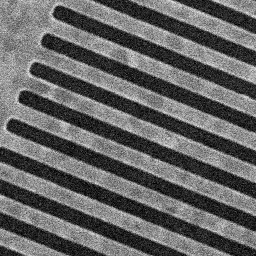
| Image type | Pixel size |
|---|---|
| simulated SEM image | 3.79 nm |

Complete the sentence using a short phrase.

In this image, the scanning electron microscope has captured parallel lines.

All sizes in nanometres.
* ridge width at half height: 56.2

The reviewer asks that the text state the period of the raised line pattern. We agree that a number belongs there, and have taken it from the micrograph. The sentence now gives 116 nm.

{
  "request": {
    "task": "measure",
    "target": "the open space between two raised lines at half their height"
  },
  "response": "59.2 nm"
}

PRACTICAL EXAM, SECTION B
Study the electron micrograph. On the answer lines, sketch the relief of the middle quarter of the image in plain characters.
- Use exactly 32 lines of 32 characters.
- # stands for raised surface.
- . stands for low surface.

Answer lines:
######...........#########......
#########..........##########...
.##########...........#########.
....#########...........########
......##########..........######
.........#########...........###
#..........##########..........#
###...........#########.........
######..........##########......
########...........#########....
.#########...........##########.
...##########..........#########
......#########...........######
........##########..........####
...........#########...........#
##...........##########.........
#####...........#########.......
#######...........##########....
##########..........##########..
...#########...........#########
.....##########..........#######
........#########...........####
..........##########..........##
##...........#########..........
####...........##########.......
#######..........##########.....
#########...........##########..
..##########..........##########
....##########...........#######
.......##########..........#####
.........##########...........##
#..........###########..........